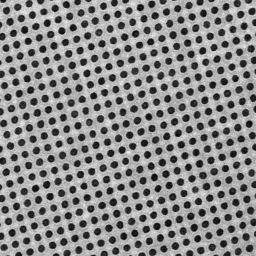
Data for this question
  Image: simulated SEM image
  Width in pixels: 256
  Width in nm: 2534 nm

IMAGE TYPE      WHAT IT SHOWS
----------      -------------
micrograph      a regular array of holes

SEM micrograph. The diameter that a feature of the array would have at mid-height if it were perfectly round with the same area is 76.6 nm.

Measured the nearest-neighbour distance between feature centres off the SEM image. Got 114 nanometers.